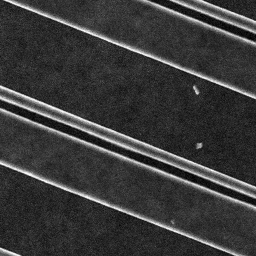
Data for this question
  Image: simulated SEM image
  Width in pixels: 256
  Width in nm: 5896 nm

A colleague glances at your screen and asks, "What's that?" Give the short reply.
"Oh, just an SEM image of lines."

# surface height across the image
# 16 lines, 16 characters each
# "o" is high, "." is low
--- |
..oooooooooooo..
....oooooooooooo
.......ooooooooo
.........ooooooo
............oooo
..............oo
ooo.............
ooooo...........
oooooooo........
oooooooooo......
.oooooooooooo...
...oooooooooooo.
......oooooooooo
........oooooooo
...........ooooo
..............oo